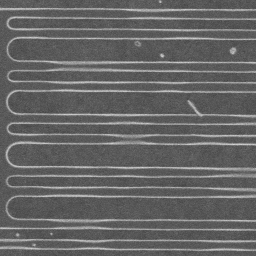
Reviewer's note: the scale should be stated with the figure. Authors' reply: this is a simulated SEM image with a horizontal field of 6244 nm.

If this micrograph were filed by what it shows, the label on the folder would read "groups of lines, slits or small figures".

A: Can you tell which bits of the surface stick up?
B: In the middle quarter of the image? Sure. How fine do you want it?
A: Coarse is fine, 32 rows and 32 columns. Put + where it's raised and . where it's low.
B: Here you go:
++++++++++++++++++++++++++++++++
....++++++++++++++++++++++++++++
................................
................................
....+++++........++++++.........
++++++++++++++++++++++++++++++++
++++++++++++++++++++++++++++++++
................................
................................
................................
................................
................................
................................
++++++++++++++++++++++++++++++++
++++++++++++++++++++++++++++++++
................................
................................
................................
++++++++++++++++++++++++++++++++
++++++++++++++++++++++++++++++++
................................
................................
................................
................................
................................
................................
++++++++++++++++++++++++++++++++
++++++++++++++++++++++++++++++++
................................
................................
................................
++++++++++++++++++++++++++++++++